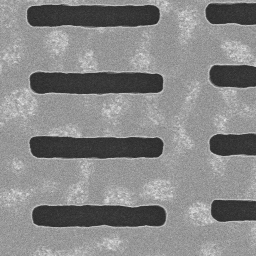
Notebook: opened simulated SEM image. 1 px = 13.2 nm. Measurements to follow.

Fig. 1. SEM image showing holes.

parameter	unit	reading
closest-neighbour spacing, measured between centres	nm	873